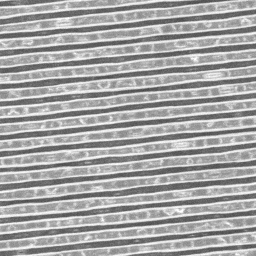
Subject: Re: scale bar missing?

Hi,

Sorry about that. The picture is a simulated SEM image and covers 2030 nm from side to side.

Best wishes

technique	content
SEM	parallel lines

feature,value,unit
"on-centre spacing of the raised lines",0.132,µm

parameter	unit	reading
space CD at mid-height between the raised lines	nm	55.2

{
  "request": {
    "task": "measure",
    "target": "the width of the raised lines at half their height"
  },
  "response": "76 nm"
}